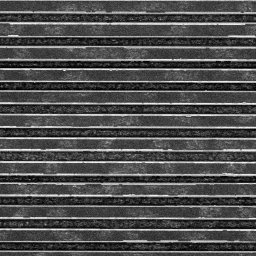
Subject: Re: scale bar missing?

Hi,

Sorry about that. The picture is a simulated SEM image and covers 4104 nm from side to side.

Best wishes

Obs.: parallel lines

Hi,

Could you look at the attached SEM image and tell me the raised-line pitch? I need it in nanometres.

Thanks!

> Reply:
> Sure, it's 366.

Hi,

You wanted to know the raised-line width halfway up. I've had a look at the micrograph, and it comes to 204 nanometers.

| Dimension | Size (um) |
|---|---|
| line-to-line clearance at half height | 0.146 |